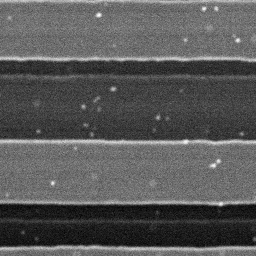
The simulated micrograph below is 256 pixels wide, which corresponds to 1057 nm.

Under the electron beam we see lines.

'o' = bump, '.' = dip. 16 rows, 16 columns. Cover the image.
oooooooooooooooo
oooooooooooooooo
oooooooooooooooo
oooooooooooooooo
................
................
................
................
................
oooooooooooooooo
oooooooooooooooo
oooooooooooooooo
oooooooooooooooo
................
................
oooooooooooooooo